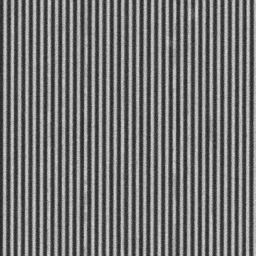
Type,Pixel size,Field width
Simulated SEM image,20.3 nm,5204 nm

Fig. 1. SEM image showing parallel lines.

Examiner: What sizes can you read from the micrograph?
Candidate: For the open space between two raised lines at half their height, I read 88.9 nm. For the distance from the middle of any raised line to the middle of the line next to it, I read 7.36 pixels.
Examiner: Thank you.